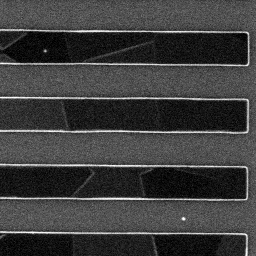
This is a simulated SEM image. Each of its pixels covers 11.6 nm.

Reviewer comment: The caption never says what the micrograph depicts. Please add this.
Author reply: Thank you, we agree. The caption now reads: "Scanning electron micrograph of wiring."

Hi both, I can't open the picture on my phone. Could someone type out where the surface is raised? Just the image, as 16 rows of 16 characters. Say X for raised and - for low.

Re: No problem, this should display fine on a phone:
----------------
----------------
XXXXXXXXXXXXXXXX
XXXXXXXXXXXXXXXX
----------------
----------------
XXXXXXXXXXXXXXX-
XXXXXXXXXXXXXXX-
----------------
----------------
XXXXXXXXXXXXXXX-
XXXXXXXXXXXXXXX-
----------------
----------------
----------------
XXXXXXXXXXXXXXX-